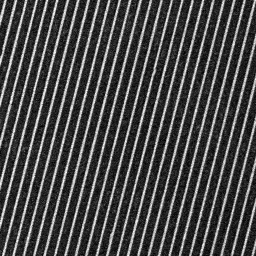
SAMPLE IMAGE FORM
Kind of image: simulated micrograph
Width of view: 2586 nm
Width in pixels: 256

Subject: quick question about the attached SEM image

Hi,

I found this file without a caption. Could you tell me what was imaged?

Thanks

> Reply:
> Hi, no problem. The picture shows parallel lines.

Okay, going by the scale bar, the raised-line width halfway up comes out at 15.9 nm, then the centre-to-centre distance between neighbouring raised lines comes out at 102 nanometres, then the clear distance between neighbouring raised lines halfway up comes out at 85.7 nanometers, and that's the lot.